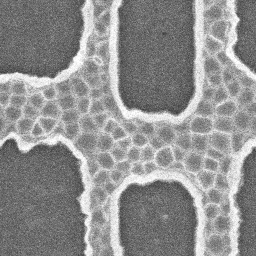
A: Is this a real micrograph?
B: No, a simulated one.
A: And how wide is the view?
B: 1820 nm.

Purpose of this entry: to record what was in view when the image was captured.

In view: one or a few lines or trenches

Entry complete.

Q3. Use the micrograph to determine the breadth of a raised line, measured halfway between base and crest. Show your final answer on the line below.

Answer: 33.6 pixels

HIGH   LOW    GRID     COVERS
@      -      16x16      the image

-----@@-----@@@-
-----@@-----@@@-
-----@@-----@@@-
-----@@-----@@@-
----@@@-----@@@@
@@@@@@@-----@@@@
@@@@@@@@----@@@@
@@@@@@@@@@@@@@@@
@@@@@@@@@@@@@@@@
-----@@@@@@@@@@-
-----@@@@@@@@@@-
-----@@@----@@@-
-----@@-----@@--
-----@@------@@-
-----@@------@@-
-----@@-----@@@-